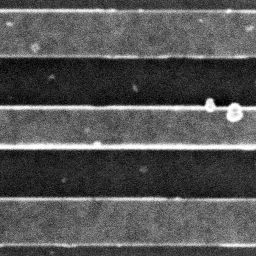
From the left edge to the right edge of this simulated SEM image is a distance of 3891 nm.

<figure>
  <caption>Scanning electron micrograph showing lines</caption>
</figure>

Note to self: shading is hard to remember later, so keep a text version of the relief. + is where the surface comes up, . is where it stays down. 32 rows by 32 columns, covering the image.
................................
++++++++++++++++++++++++++++++++
++++++++++++++++++++++++++++++++
++++++++++++++++++++++++++++++++
++++++++++++++++++++++++++++++++
++++++++++++++++++++++++++++++++
++++++++++++++++++++++++++++++++
................................
................................
................................
................................
................................
................................
++++++++++++++++++++++++++++++++
++++++++++++++++++++++++++++++++
++++++++++++++++++++++++++++++++
++++++++++++++++++++++++++++++++
++++++++++++++++++++++++++++++++
++++++++++++++++++++++++++++++++
................................
................................
................................
................................
................................
................................
++++++++++++++++++++++++++++++++
++++++++++++++++++++++++++++++++
++++++++++++++++++++++++++++++++
++++++++++++++++++++++++++++++++
++++++++++++++++++++++++++++++++
++++++++++++++++++++++++++++++++
................................